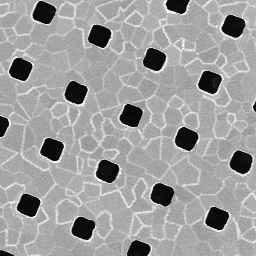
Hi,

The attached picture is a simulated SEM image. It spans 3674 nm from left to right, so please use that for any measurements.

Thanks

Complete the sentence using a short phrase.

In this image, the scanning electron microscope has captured a regular array of holes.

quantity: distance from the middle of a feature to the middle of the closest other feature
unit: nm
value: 855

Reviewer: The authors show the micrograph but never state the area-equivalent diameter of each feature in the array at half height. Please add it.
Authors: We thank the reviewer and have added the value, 323 nm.